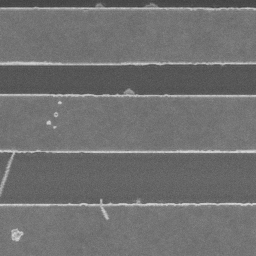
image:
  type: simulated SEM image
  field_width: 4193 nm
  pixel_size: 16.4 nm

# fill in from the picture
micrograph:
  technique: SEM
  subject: lines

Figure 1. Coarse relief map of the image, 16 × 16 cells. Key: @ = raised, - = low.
--@-------------
@@@@@@@@@@@@@@@@
@@@@@@@@@@@@@@@@
@@@@@@@@@@@@@@@@
----------------
----------------
@@@@@@@@@@@@@@@@
@@@@@@@@@@@@@@@@
@@@@@@@@@@@@@@@@
@--@@@@@@@@@@@@@
----------------
----------------
----------------
@@@@@@@@@@@@@@@@
@@@@@@@@@@@@@@@@
@@@@@@@@@@@@@@@@